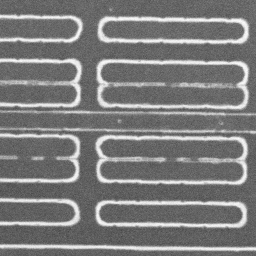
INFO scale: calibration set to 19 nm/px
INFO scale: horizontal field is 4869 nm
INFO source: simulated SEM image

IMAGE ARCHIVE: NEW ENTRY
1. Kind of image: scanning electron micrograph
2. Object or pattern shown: wiring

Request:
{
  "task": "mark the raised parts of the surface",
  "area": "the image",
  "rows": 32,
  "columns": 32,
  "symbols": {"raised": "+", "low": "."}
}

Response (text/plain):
................................
................................
+++++++++....+++++++++..........
++++++++++...++++++++++++++++++.
++++++++++...++++++++++++++++++.
................................
................................
................................
++++++++++..+++++++++++++++++++.
++++++++++..+++++++++++++++++++.
++++++++++...+++++++++++++++++..
++++++++++...++++++++++++++++++.
++++++++++...++++++++++++++++++.
................................
.......................+++......
......................++++......
................................
+++++++++....+++++++++++++++++..
++++++++++..+++++++++++++++++++.
+++++++++....+++++++++++++++++..
++++++++++..++++++++++++++++++..
++++++++++..+++++++++++++++++++.
+++++++++....+++++++++++++++++..
................................
................................
+++++++++....+++++++++++++++....
++++++++++..++++++++++++++++++..
+++++++++...++++++++++++++++++..
................................
................................
................................
++++++++++++++++++++++++++++++++